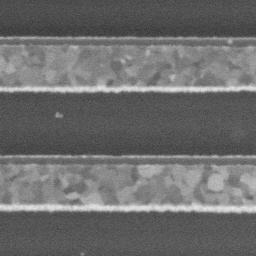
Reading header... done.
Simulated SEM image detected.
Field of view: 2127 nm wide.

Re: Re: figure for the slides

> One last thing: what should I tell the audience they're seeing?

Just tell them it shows lines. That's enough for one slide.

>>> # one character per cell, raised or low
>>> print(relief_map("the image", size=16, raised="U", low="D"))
DDDDDDDDDDDDDDDD
DDDDDDDDDDDDDDDD
UUUUUUUUUUUUUUUU
UUUUUUUUUUUUUUUU
UUUUUUUUUUUUUUUU
UUUUUDUUUDUDDDDD
DDDDDDDDDDDDDDDD
DDDDDDDDDDDDDDDD
DDDDDDDDDDDDDDDD
DDDDDDDDDDDDDDDD
UUUUUUUUUUUUUUUU
UUUUUUUUUUUUUUUU
UUUUUUUUUUUUUUUU
DDDDDDDDDDDDDDDD
DDDDDDDDDDDDDDDD
DDDDDDDDDDDDDDDD